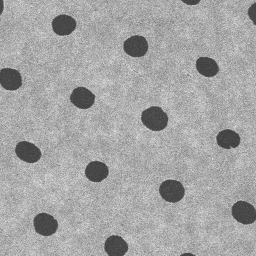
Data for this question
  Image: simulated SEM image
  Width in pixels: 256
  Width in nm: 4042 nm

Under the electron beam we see a regular array of holes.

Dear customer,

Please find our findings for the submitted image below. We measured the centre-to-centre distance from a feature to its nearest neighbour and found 1170 nanometers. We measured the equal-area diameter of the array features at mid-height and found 0.368 micrometres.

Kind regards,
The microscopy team